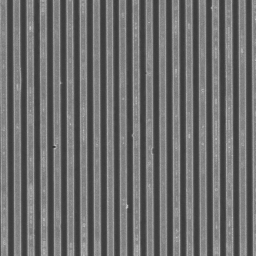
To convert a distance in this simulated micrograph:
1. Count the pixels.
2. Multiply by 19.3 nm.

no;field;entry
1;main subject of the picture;parallel lines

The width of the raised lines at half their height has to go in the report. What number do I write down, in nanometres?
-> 142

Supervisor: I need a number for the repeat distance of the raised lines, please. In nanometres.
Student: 255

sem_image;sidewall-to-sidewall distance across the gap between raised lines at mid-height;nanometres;108